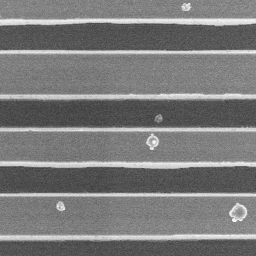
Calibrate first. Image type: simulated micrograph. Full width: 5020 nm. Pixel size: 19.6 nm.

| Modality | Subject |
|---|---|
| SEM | lines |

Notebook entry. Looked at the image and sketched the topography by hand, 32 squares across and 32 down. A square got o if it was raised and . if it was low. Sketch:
oooooooooooooooooooooooooooooooo
oooooooooooooooooooooooooooooooo
oooooooooooooooooooooooooooooooo
................................
................................
................................
................................
oooooooooooooooooooooooooooooooo
oooooooooooooooooooooooooooooooo
oooooooooooooooooooooooooooooooo
oooooooooooooooooooooooooooooooo
oooooooooooooooooooooooooooooooo
................................
................................
................................
................................
oooooooooooooooooooooooooooooooo
oooooooooooooooooooooooooooooooo
oooooooooooooooooooooooooooooooo
oooooooooooooooooooooooooooooooo
....ooooooooooooooooooooooooo..o
................................
................................
................................
oooooooooooooooooooooooooooooooo
oooooooooooooooooooooooooooooooo
oooooooooooooooooooooooooooooooo
oooooooooooooooooooooooooooooooo
oooooooooooooooooooooooooooooooo
oooooooooooooooo................
................................
................................